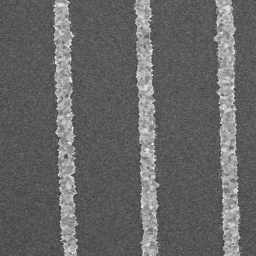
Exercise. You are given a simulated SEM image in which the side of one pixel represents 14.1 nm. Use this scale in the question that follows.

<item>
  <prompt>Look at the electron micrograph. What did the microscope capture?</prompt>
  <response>one or a few lines or trenches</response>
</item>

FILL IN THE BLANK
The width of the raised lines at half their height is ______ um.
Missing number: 0.201